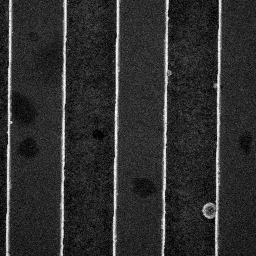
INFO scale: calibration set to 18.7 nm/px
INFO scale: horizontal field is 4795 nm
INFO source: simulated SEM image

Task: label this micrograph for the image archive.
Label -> lines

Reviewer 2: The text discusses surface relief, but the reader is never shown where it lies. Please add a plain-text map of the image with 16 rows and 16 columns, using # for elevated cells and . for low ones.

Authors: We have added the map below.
.###...####...##
.###...###....##
.###...###....##
.###...###....##
.###...###....##
.###...###....##
.###...###....##
.###...###....##
.###...###....##
####...###....##
####...###....##
####...###....##
####...###....##
####...###...###
####...###...###
####...###...###